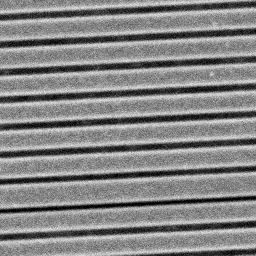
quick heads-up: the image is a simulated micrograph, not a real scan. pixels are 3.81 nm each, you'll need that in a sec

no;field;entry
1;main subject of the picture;parallel lines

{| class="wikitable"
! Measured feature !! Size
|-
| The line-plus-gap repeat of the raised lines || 0.105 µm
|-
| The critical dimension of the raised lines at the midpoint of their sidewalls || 19.7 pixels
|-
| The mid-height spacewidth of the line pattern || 0.0271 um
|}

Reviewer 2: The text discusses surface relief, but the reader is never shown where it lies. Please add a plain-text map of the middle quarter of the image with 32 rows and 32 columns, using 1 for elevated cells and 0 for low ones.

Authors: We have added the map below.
00000000000000000000000000000000
00000000000000001111111111111111
11111111111111111111111111111111
11111111111111111111111111111111
11111111111111111111111111111111
11111111111111111111111111111100
11111111111000000000000000000000
00000000000000000000000000000000
00000000000000011111111111111111
11111111111111111111111111111111
11111111111111111111111111111111
11111111111111111111111111111111
11111111111111111111111111111000
11111111110000000000000000000000
00000000000000000000000000000111
00000000001111111111111111111111
11111111111111111111111111111111
11111111111111111111111111111111
11111111111111111111111111111111
11111111111111111111111111110000
11111111100000000000000000000000
00000000000000000000000000001111
00000000011111111111111111111111
11111111111111111111111111111111
11111111111111111111111111111111
11111111111111111111111111111111
11111111111111111111111110000000
11110000000000000000000000000000
00000000000000000000000111111111
00001111111111111111111111111111
11111111111111111111111111111111
11111111111111111111111111111111